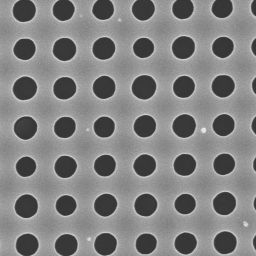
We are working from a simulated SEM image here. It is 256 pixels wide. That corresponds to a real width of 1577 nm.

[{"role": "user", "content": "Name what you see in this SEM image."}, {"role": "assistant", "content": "a regular array of holes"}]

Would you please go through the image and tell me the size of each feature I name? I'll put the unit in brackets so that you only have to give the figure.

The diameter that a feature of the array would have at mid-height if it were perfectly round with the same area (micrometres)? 0.139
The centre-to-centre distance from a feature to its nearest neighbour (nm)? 240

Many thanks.